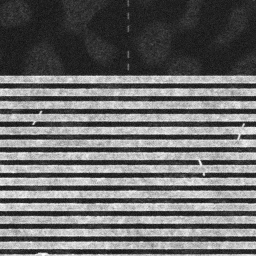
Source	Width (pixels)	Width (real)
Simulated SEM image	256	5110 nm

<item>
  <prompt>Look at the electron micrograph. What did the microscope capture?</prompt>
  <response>parallel lines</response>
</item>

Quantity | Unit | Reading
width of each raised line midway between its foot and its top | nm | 137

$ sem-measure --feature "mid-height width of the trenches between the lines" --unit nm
115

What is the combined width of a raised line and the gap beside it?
255 nm